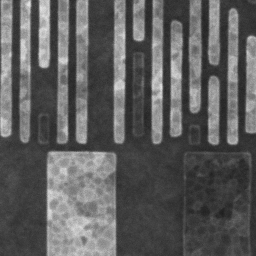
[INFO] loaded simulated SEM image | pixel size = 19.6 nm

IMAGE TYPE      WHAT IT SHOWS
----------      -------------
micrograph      wiring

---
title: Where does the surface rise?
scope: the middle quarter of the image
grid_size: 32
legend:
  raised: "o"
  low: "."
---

o..ooo.......oo...oo..oo...oo...
o..ooo.......oo...oo..oo...oo...
o..ooo.......oo...oo..oo...oo...
o..ooo.......oo...oo..oo...oo...
o..ooo.......oo...oo..oo...oo...
o..ooo.......oo...oo..oo...oo...
o..ooo.......oo...oo..oo...oo...
o..ooo.......oo...oo..oo...oo...
o..ooo.......oo...oo..oo...oo...
o..ooo.......oo...oo..oo...oo...
o..ooo.......oo...oo..oo...oo...
o..ooo.......oo...oo..oo...oo...
o..ooo.......oo...oo..oo...oo...
o..ooo.......oo...oo..oo...oo...
o..oo........oo...oo..oo...oo...
o..oo........oo...oo..oo...oo...
o..oo........oo..ooo..oo...oo...
o..oo........oo...o...oo...oo..o
o..oo........oo.......oo.......o
....o........o.........o........
................................
................................
ooooooooooooo.................oo
ooooooooooooo.................oo
ooooooooooooo.................oo
ooooooooooooo.................oo
ooooooooooooo.................oo
ooooooooooooo.................oo
ooooooooooooo.................oo
ooooooooooooo.................oo
ooooooooooooo.................oo
ooooooooooooo.................oo